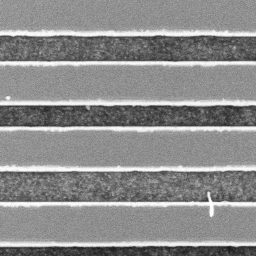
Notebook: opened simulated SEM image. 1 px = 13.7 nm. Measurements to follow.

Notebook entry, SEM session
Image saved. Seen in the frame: lines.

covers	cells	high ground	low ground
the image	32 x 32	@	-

@@@@@@@@@@@@@@@@@@@@@@@@@@@@@@@@
@@@@@@@@@@@@@@@@@@@@@@@@@@@@@@@@
@@@@@@@@@@@@@@@@@@@@@@@@@@@@@@@@
@@@@@@@@@@@@@@@@@@@@@@@@@@@@@@@@
--------------------------------
--------------------------------
--------------------------------
--------------------------------
@@@@@@@@@@@@@@@@@@@@@@@@@@@@@@@@
@@@@@@@@@@@@@@@@@@@@@@@@@@@@@@@@
@@@@@@@@@@@@@@@@@@@@@@@@@@@@@@@@
@@@@@@@@@@@@@@@@@@@@@@@@@@@@@@@@
@@@@@@@@@@@@@@@@@@@@@@@@@@@@@@@@
--------------------------------
--------------------------------
--------------------------------
@@@@@@@@@@@@@@@@@@@@@@@@@@@@@@@@
@@@@@@@@@@@@@@@@@@@@@@@@@@@@@@@@
@@@@@@@@@@@@@@@@@@@@@@@@@@@@@@@@
@@@@@@@@@@@@@@@@@@@@@@@@@@@@@@@@
@@@@@@@@@@@@@@@@@@@@@@@@@@@@@@@@
--------------------------------
--------------------------------
--------------------------------
--------------------------------
@@@@@@@@@@@@@@@@@@@@@@@@@@@@@@@@
@@@@@@@@@@@@@@@@@@@@@@@@@@@@@@@@
@@@@@@@@@@@@@@@@@@@@@@@@@@@@@@@@
@@@@@@@@@@@@@@@@@@@@@@@@@@@@@@@@
@@@@@@@@@@@@@@@@@@@@@@@@@@@@@@@@
@@@@@@@@@@@@@@@@@@@@@@@@@@@@@@@@
--------------------------------